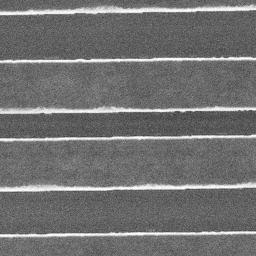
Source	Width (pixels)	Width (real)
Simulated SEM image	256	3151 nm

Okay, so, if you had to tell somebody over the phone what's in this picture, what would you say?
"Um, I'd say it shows lines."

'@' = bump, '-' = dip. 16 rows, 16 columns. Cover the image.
@@@@@@@@@@@@@@@@
----------------
----------------
----------------
@@@@@@@@@@@@@@@@
@@@@@@@@@@@@@@@@
@@@@@@@@@@@@@@@@
----------------
----------------
@@@@@@@@@@@@@@@@
@@@@@@@@@@@@@@@@
@@@@@@@@@@@@@@@@
----------------
----------------
----------------
@@@@@@@@@@@@@@@@